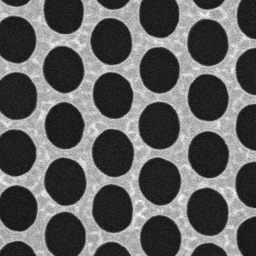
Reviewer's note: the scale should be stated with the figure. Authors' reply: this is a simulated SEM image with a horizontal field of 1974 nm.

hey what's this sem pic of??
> a regular array of holes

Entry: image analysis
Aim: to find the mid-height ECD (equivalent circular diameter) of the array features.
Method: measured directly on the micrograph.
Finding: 44.2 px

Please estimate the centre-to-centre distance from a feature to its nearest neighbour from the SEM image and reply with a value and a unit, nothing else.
420 nanometers